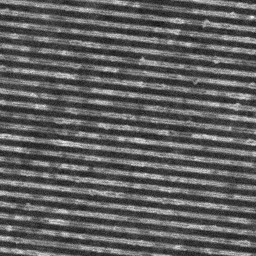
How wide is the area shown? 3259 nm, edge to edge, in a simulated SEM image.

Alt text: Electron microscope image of parallel lines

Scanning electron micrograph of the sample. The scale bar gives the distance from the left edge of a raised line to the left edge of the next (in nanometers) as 143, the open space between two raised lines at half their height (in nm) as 93.3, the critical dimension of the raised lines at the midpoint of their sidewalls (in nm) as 47.5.